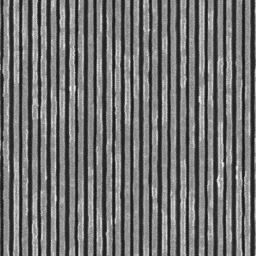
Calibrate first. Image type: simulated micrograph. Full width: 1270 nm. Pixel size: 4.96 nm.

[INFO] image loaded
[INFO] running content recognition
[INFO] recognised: parallel lines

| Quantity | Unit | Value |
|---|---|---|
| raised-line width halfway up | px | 5.75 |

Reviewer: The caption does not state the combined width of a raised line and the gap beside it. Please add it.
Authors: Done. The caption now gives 0.046 µm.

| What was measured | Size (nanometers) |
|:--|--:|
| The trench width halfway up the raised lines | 18.6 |